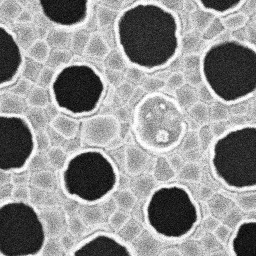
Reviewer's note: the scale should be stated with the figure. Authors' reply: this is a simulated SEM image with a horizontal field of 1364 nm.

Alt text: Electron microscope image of holes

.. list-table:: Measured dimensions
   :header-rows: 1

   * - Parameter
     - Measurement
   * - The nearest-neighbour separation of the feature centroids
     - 470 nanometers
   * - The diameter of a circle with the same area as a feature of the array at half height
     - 261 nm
